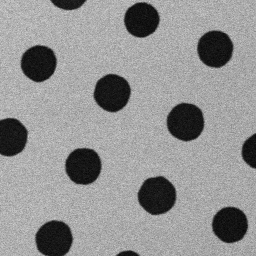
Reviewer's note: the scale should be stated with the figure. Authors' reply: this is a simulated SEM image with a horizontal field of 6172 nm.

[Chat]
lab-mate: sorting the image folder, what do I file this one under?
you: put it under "a regular array of holes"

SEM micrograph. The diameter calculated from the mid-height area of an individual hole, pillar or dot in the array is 0.889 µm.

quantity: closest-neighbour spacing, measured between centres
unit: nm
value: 1900